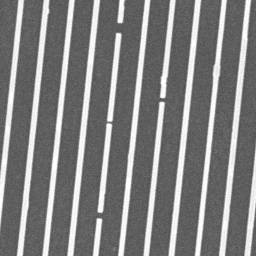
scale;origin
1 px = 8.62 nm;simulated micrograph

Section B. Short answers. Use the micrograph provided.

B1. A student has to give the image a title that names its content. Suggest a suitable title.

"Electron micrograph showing parallel lines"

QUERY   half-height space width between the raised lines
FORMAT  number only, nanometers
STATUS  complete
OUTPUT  175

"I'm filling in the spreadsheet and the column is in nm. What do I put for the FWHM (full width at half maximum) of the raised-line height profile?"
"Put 37.5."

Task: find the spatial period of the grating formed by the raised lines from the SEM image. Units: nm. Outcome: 216